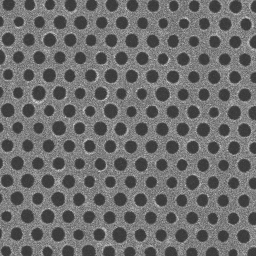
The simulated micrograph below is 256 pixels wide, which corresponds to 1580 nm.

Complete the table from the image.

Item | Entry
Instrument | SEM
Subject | a regular array of holes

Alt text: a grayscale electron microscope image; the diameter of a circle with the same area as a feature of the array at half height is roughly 12.2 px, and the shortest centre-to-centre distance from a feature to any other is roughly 124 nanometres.